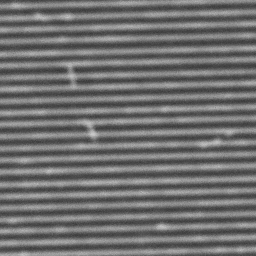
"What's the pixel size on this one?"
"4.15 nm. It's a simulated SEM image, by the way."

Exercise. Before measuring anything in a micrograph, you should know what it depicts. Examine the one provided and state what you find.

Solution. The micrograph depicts parallel lines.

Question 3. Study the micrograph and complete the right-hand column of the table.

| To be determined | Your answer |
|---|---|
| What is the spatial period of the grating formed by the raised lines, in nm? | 49.2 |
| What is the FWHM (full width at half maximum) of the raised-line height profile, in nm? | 11.9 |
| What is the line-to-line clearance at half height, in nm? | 35.3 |